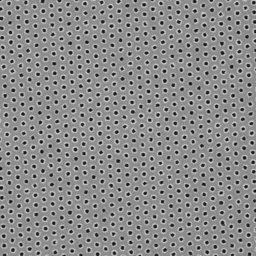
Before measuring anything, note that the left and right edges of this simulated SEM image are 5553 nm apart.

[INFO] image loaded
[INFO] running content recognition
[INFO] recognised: a regular array of holes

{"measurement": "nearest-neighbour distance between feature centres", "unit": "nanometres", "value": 205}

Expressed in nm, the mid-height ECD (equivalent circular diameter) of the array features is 84.8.